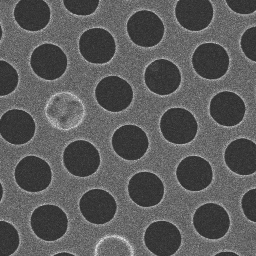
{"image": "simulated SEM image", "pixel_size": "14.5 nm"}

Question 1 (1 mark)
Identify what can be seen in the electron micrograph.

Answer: a regular array of holes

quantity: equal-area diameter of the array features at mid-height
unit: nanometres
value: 526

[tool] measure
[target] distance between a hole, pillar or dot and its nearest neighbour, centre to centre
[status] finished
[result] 732 nanometers